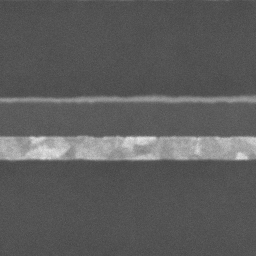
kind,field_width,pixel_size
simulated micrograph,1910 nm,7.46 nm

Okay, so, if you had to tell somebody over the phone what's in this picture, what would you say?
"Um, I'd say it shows lines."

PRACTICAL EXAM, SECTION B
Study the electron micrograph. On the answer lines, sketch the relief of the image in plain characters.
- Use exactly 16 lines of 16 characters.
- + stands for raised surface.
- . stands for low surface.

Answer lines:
................
................
................
................
................
................
++++++++++++++++
++++++++++++++++
++++++++++++++++
++++++++++++++++
................
................
................
................
................
................